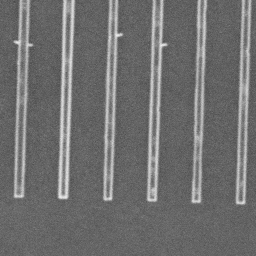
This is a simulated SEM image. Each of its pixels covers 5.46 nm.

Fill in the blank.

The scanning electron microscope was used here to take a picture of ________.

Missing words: parallel lines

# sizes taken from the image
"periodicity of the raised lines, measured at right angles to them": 0.242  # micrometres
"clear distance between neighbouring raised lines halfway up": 0.204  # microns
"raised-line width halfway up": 0.0389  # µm